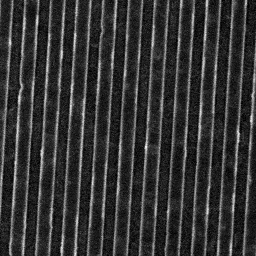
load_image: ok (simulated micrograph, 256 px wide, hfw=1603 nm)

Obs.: parallel lines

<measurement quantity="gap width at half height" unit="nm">75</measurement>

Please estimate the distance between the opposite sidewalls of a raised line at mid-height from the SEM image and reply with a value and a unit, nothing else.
90.6 nm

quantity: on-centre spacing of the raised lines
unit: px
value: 25.9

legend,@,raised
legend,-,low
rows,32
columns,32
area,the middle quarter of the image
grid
--@@@@---@@@---@@@@---@@@---@@@@
--@@@@---@@@---@@@@---@@@---@@@@
--@@@@---@@@---@@@----@@@---@@@-
--@@@----@@@---@@@----@@@---@@@-
--@@@----@@@---@@@---@@@@---@@@-
--@@@----@@@---@@@---@@@@---@@@-
--@@@---@@@@---@@@---@@@@---@@@-
--@@@---@@@@---@@@---@@@@---@@@-
--@@@---@@@@---@@@---@@@@---@@@-
--@@@---@@@@---@@@---@@@@---@@@-
--@@@---@@@---@@@@---@@@@---@@@-
--@@@---@@@---@@@@---@@@----@@@-
-@@@@---@@@---@@@@---@@@----@@@-
-@@@@---@@@---@@@@---@@@----@@@-
-@@@@---@@@---@@@@---@@@----@@@-
-@@@@---@@@---@@@@---@@@---@@@@-
-@@@@---@@@---@@@@---@@@---@@@@-
-@@@@---@@@---@@@@---@@@---@@@@-
-@@@@---@@@---@@@@---@@@---@@@@-
-@@@@---@@@---@@@@---@@@---@@@--
-@@@----@@@---@@@@--@@@@---@@@--
-@@@----@@@---@@@---@@@@---@@@@-
-@@@----@@@---@@@---@@@@---@@@--
-@@@---@@@@---@@@---@@@@---@@@--
-@@@---@@@@---@@@---@@@@---@@@--
-@@@---@@@@---@@@---@@@@---@@@--
-@@@---@@@@---@@@---@@@@---@@@--
-@@@---@@@----@@@---@@@@---@@@--
-@@@---@@@----@@@---@@@---@@@@--
@@@@---@@@----@@@---@@@---@@@@--
@@@@---@@@---@@@@---@@@---@@@@--
@@@@---@@@---@@@@---@@@---@@@@--